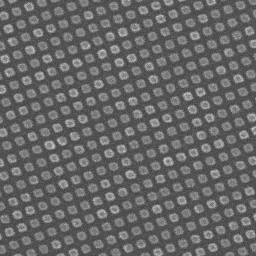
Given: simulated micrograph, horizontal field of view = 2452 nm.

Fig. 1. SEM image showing a regular array of raised bodies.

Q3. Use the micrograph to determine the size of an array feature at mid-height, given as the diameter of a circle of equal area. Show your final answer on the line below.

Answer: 79.5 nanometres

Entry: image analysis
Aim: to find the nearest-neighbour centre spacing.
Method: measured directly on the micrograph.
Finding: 127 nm